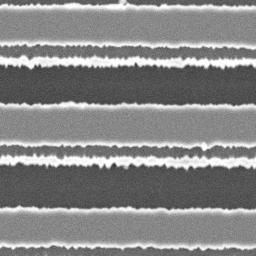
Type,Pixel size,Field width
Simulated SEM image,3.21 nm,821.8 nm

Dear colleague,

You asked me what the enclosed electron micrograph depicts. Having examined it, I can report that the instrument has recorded lines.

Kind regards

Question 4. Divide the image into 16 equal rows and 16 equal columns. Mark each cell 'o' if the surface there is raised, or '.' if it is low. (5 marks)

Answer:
oooooooooooooooo
oooooooooooooooo
oooooooooooooooo
oooooooooooooooo
................
................
....o...........
oooooooooooooooo
oooooooooooooooo
oooooooooooooooo
................
................
................
oooooooooooooooo
oooooooooooooooo
oooooooooooooooo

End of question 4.